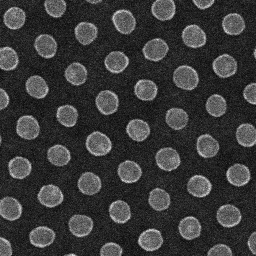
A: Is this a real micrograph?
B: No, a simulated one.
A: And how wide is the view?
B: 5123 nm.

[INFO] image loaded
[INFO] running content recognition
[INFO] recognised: a regular array of raised bodies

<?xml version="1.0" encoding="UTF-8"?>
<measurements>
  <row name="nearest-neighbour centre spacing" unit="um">0.815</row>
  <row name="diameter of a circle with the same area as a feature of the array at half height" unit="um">0.437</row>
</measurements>